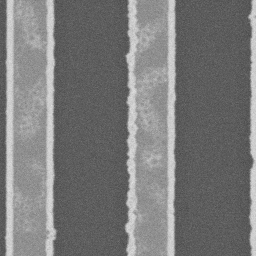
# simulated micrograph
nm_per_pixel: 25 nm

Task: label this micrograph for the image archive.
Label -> one or a few lines or trenches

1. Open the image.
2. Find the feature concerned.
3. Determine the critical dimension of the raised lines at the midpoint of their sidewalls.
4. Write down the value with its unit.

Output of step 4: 994 nm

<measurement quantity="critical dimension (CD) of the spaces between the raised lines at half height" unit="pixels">83.1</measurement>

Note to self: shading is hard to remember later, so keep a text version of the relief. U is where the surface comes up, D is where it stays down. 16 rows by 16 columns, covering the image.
DUUDDDDDUUUDDDDD
DUUDDDDDUUUDDDDD
DUUDDDDDUUUDDDDD
DUUDDDDDUUUDDDDD
DUUDDDDDUUUDDDDD
DUUDDDDDUUUDDDDD
DUUDDDDDUUUDDDDD
DUUDDDDDUUUDDDDD
DUUDDDDDUUUDDDDD
DUUDDDDDUUUDDDDD
DUUDDDDDUUUDDDDD
DUUDDDDDUUUDDDDD
DUUDDDDDUUUDDDDD
DUUDDDDDUUUDDDDD
DUUDDDDDUUUDDDDD
DUUDDDDDUUUDDDDD